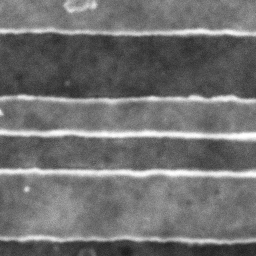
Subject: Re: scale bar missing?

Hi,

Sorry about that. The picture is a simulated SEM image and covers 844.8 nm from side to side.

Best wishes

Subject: lines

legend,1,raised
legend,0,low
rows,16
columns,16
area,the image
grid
1111111111111111
1111111111111111
0000000000000000
0000000000000000
0000000000000000
0000000000000000
1111111111111111
1111111111111111
1111111111111111
1111111111111111
1111111111111111
1111111111111111
1111111111111111
1111111111111111
1111111111111111
0000000000000000